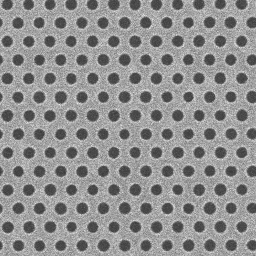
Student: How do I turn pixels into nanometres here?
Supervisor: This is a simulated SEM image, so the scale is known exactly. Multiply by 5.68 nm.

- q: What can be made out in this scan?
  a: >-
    a regular array of holes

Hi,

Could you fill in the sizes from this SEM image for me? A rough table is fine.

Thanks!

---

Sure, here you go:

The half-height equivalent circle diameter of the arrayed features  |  11.6 pixels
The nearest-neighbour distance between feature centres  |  119 nm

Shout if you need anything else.